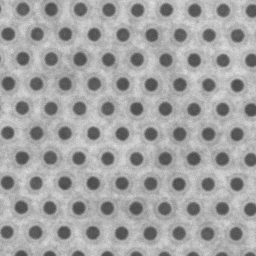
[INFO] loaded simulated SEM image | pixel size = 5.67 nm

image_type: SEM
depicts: a regular array of holes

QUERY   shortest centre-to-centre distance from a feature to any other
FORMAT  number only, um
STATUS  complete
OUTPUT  0.16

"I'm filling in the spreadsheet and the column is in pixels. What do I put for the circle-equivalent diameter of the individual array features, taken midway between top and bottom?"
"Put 15.2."